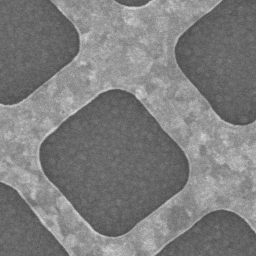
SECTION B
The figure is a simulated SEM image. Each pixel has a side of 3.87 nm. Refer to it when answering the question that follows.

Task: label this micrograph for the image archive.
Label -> holes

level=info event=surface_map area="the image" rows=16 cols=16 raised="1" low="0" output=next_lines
0000111111111000
0000011111110000
0000011111100000
0000011111100000
0000111111100000
0011111111110000
0111100001111000
1111000000111100
1110000000011111
1100000000001111
1110000000001111
1110000000001111
0011000000011111
0011100001111001
0001110011110000
0000111111000000